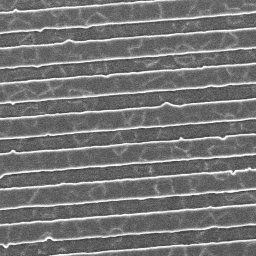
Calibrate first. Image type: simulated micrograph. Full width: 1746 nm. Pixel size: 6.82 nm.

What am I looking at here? parallel lines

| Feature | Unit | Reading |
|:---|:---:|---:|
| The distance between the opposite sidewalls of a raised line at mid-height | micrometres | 0.139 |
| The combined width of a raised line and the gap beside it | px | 35.2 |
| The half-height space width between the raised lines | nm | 99.4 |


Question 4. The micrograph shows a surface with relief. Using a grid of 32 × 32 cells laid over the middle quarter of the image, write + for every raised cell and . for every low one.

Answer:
................................
...........................+++++
..............++++++++++++++++++
.+++++++++++++++++++++++++++++++
++++++++++++++++++++++++++++++++
++++++++++++++++++++++++++++++++
++++++++++++++++++++++++++.+....
+++++++++++++...................
++++............................
................................
........................++++++++
..............++++++++++++++++++
++++++++++++++++++++++++++++++++
++++++++++++++++++++++++++++++++
++++++++++++++++++++++++++++++++
++++++++++++++++++++++++++......
+++++++++++++...................
................................
................................
.....................+++++++++++
............++++++++++++++++++++
++++++++++++++++++++++++++++++++
++++++++++++++++++++++++++++++++
++++++++++++++++++++++++++++++++
++++++++++++++++++++++++........
+++++++++++.....................
................................
...............................+
......................++++++++++
.........+++++++++++++++++++++++
++++++++++++++++++++++++++++++++
++++++++++++++++++++++++++++++++